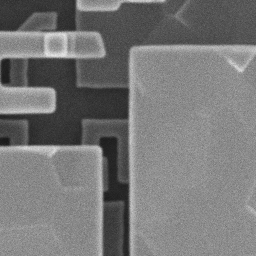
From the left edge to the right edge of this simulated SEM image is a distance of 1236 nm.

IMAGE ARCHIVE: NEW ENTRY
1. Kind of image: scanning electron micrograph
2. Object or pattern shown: wiring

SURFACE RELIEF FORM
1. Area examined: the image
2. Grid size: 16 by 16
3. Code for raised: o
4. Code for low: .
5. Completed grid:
.....oo.........
................
oooooo..........
oooooo..oooooooo
........oooooooo
o.......oooooooo
ooo.....oooooooo
........oooooooo
........oooooooo
oooooo..oooooooo
oooooo..oooooooo
oooooo..oooooooo
oooooo..oooooooo
oooooo..oooooooo
oooooo..oooooooo
oooooo..oooooooo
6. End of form